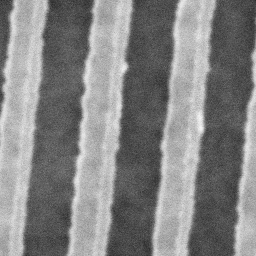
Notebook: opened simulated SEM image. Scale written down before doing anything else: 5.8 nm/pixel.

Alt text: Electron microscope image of lines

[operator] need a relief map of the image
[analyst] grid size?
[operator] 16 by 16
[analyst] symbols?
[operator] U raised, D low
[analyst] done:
DUUDDDUUDDDUUDDD
DUUDDDUUDDDUUDDD
DUUDDDUUDDDUUDDD
DUUDDDUUDDDUUDDD
UUUDDUUUDDDUUDDD
UUDDDUUUDDDUUDDD
UUDDDUUUDDDUUDDD
UUDDDUUDDDUUUDDD
UUDDDUUDDDUUUDDU
UUDDDUUDDDUUDDDU
UUDDDUUDDDUUDDDU
UUDDDUUDDDUUDDDU
UUDDDUUDDDUUDDDU
UDDDDUUDDDUUDDDU
UDDDUUUDDDUUDDDU
UDDDUUUDDDUUDDDU